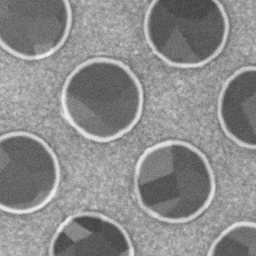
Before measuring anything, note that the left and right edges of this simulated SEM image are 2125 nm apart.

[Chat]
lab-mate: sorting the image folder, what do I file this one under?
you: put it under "raised bodies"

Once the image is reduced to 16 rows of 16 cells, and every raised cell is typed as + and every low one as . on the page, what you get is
++++.....+++++..
++++.....+++++..
++++.....+++++..
.++.......+++...
.....+++.......+
....+++++.....++
....+++++.....++
....++++......++
++....+.......++
+++......+++....
++++.....++++...
++++.....++++...
+++......++++...
.....+....++....
....++++......++
...+++++.....+++